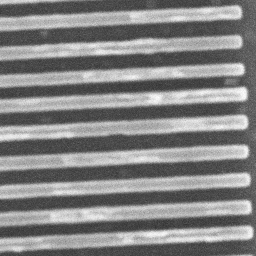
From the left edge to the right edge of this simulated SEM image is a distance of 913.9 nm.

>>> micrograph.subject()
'parallel lines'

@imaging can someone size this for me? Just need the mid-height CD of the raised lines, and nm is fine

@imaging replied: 41.4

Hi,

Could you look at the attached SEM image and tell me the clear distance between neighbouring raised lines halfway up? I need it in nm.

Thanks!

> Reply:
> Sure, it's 59.1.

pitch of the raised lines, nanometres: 98.2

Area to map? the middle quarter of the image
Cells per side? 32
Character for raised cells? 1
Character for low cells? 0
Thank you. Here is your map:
00000000000000000000000000000000
00000000000000001111111111111111
11111111111111111111111111111111
11111111111111111111110000000000
00100000000000000000000000000000
00000000000000000000000000000000
00000000000000000000000000000000
00000000000000000000111111111111
00011111111111111111111111111111
11111111111111111111111111111111
11111111001100000000000000000000
00000000000000000000000000000000
00000000000000000000000000000000
00000000000000000000000000000000
00000000000000000001111111111111
11111111111111111111111111111111
11111111111111111111111111110000
11111111100000000000000000000000
00000000000000000000000000000000
00000000000000000000000000000000
00000000000000000000000000000000
00000000000000000000000001111111
00000000001111111111111111111111
11111111111111111111111111111111
11111111111111110000000000000000
00000000000000000000000000000000
00000000000000000000000000000000
00000000000000000000000000000000
00000000000000000000000000000001
00000000000111111111111111111111
11111111111111111111111111111111
11111111111111110111100000000000